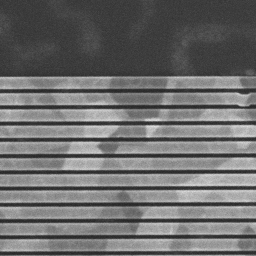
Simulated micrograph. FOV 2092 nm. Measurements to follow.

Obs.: parallel lines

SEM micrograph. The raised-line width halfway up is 91.9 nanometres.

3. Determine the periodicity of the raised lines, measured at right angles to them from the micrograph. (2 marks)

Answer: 16.2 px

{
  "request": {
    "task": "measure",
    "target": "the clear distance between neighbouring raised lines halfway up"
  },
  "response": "38.8 nm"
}